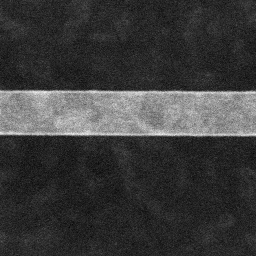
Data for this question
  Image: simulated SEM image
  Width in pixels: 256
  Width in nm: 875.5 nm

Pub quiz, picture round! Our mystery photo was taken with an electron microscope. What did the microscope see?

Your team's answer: one or a few lines or trenches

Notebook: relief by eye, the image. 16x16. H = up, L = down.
LLLLLLLLLLLLLLLL
LLLLLLLLLLLLLLLL
LLLLLLLLLLLLLLLL
LLLLLLLLLLLLLLLL
LLLLLLLLLLLLLLLL
LLLLLLLLLLLLLLLL
HHHHHHHHHHHHHHHH
HHHHHHHHHHHHHHHH
LLLLLLLLLLLLLLLL
LLLLLLLLLLLLLLLL
LLLLLLLLLLLLLLLL
LLLLLLLLLLLLLLLL
LLLLLLLLLLLLLLLL
LLLLLLLLLLLLLLLL
LLLLLLLLLLLLLLLL
LLLLLLLLLLLLLLLL